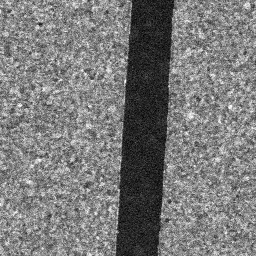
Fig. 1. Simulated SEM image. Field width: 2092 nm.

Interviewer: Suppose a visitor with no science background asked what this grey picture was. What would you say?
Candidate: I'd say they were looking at one or a few lines or trenches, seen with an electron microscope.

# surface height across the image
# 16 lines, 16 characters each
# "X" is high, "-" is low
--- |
XXXXXXXX---XXXXX
XXXXXXXX---XXXXX
XXXXXXXX---XXXXX
XXXXXXXX---XXXXX
XXXXXXXX---XXXXX
XXXXXXXX---XXXXX
XXXXXXXX---XXXXX
XXXXXXXX--XXXXXX
XXXXXXXX--XXXXXX
XXXXXXXX--XXXXXX
XXXXXXXX--XXXXXX
XXXXXXX---XXXXXX
XXXXXXX---XXXXXX
XXXXXXX---XXXXXX
XXXXXXX---XXXXXX
XXXXXXX---XXXXXX